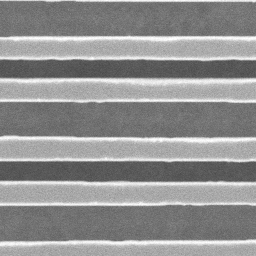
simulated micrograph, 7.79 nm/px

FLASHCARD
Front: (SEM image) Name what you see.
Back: lines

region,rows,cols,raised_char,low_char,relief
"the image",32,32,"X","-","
--------------------------------
--------------------------------
--------------------------------
--------------------------------
--------------------------------
XXXXXXXXXXXXXXXXXXXXXXXXXXXXXXXX
XXXXXXXXXXXXXXXXXXXXXXXXXXXXXXXX
-------------------------XX-----
--------------------------------
--------------------------------
XXXXXXXXXXXXXXXXXXXXXXXXXXXXXXXX
XXXXXXXXXXXXXXXXXXXXXXXXXXXXXXXX
XXXXXXXXXXXXXXXXXXXXXXXXXXXXXXXX
--------------------------------
--------------------------------
--------------------------------
--------------------------------
XXXXXXXXXXXXXXXXXXXXXXXXXXXXXXXX
XXXXXXXXXXXXXXXXXXXXXXXXXXXXXXXX
XXXXXXXXXXXXXXXXXXXXXXXXXXXXXXXX
--------------------------------
--------------------------------
--------------------------------
XXXXXXXXXXXXXXXXXXXXXXXXXXXXXXXX
XXXXXXXXXXXXXXXXXXXXXXXXXXXXXXXX
XXXXXXXXXXXXXXXXXXXXXXXXXXXXXXXX
--------------------------------
--------------------------------
--------------------------------
--------------------------------
XXXXXXXXXXXXXXXXXXXXXXXXXXXXXXXX
XXXXXXXXXXXXXXXXXXXXXXXXXXXXXXXX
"